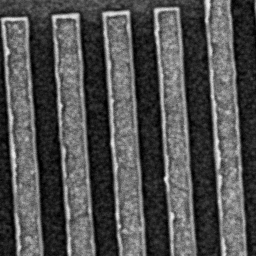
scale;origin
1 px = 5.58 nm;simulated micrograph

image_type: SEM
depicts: parallel lines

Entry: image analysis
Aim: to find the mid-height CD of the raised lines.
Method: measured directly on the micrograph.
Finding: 25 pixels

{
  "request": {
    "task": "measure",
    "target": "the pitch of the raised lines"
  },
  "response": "284 nm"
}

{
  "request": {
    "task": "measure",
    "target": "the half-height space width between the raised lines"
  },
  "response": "0.145 micrometres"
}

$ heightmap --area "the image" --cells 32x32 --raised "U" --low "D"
DDDDDDDDDDDDDDDDDDDDDDDDDDUUUDDD
DDDDDDDDDDDDDDDDDDDUUUDDDDUUUDDD
UUUDDDDUUUDDDUUUDDDUUUDDDDUUUDDD
UUUDDDDUUUDDDUUUDDDUUUUDDDUUUDDD
UUUDDDDUUUDDDUUUDDDUUUUDDDUUUDDD
UUUDDDDUUUDDDUUUDDDDUUUDDDUUUDDD
DUUUDDDUUUDDDUUUDDDDUUUDDDUUUDDD
DUUUDDDUUUDDDUUUUDDDUUUDDDUUUDDD
DUUUDDDUUUDDDUUUUDDDUUUDDDUUUDDD
DUUUDDDUUUDDDUUUUDDDUUUDDDUUUDDD
DUUUDDDUUUDDDUUUUDDDUUUDDDUUUDDD
DUUUDDDUUUDDDDUUUDDDUUUDDDUUUDDD
DUUUDDDUUUDDDDUUUDDDUUUDDDUUUUDD
DUUUDDDUUUUDDDUUUDDDUUUDDDDUUUDD
DUUUDDDUUUUDDDUUUDDDUUUDDDDUUUDD
DUUUDDDUUUUDDDUUUDDDUUUDDDDUUUDD
DUUUDDDUUUUDDDUUUDDDUUUDDDDUUUDD
DUUUDDDDUUUDDDUUUDDDUUUDDDDUUUDD
DUUUDDDDUUUDDDUUUDDDUUUUDDDUUUDD
DUUUDDDDUUUDDDUUUDDDDUUUDDDUUUDD
DDUUUDDDUUUDDDUUUDDDDUUUDDDUUUDD
DDUUUDDDUUUDDDUUUDDDDUUUDDDUUUDD
DDUUUDDDUUUDDDUUUUDDDUUUDDDUUUDD
DDUUUDDDUUUDDDUUUUDDDUUUDDDUUUDD
DDUUUDDDUUUDDDDUUUDDDUUUDDDUUUDD
DDUUUDDDUUUDDDDUUUDDDUUUDDDUUUDD
DDUUUDDDUUUDDDDUUUDDDUUUDDDDUUDD
DDUUUDDDUUUDDDDUUUDDDUUUDDDDUUUD
DDUUUDDDUUUDDDDUUUDDDUUUDDDDUUUD
DDUUUDDDUUUUDDDUUUDDDUUUDDDDUUUD
DDUUUDDDUUUUDDDUUUDDDUUUDDDDUUUD
DDUUUDDDDUUUDDDUUUDDDUUUDDDDUUUD